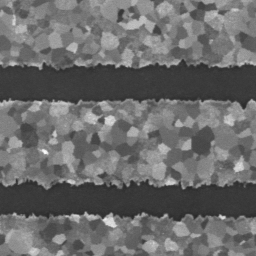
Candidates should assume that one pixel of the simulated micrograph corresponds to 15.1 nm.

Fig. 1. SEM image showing one or a few lines or trenches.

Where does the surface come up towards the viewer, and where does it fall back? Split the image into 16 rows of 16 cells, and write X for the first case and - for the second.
XXXXXXXXXXXXXXXX
XXXXXXXXXXXXXXXX
XXXXXXXXXXXXXXXX
XXXXXXXXXXXXXXXX
----------------
----------------
XXXXXXXXXXXXXXX-
XXXXXXXXXXXXXXXX
XXXXXXXXXXXXXXXX
XXXXXXXXXXXXXXXX
XXXXXXXXXXXXXXXX
-------X---XXX--
----------------
X----X----------
XXXXXXXXXXXXXXXX
XXXXXXXXXXXXXXXX